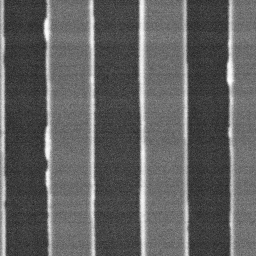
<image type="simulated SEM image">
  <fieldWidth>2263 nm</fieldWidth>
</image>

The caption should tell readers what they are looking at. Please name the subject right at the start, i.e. lines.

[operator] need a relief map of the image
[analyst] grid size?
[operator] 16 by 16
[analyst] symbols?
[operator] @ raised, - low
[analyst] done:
---@@@---@@@--@@
---@@@---@@@--@@
---@@@---@@@--@@
---@@@---@@@--@@
---@@@---@@@--@@
---@@@---@@@--@@
---@@@---@@@--@@
---@@@---@@@--@@
---@@@---@@@--@@
---@@@---@@@--@@
---@@@---@@@--@@
---@@@---@@@--@@
---@@@---@@@--@@
---@@@---@@@--@@
---@@@---@@@--@@
---@@@---@@@--@@